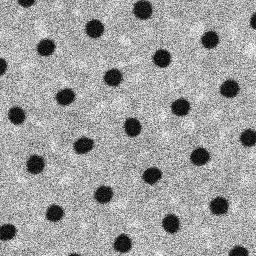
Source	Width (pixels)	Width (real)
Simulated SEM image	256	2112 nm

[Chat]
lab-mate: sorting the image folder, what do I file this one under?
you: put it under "a regular array of holes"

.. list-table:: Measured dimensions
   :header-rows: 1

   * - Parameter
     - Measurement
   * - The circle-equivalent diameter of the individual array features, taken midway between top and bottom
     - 155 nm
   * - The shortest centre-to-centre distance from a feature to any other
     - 0.428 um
